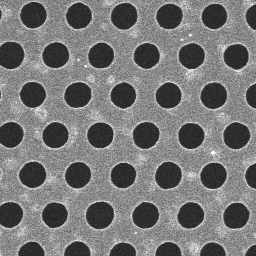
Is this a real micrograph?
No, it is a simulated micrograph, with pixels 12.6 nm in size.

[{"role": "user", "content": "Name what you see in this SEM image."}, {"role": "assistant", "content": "a regular array of holes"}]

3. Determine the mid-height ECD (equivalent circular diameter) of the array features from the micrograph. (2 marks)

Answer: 0.332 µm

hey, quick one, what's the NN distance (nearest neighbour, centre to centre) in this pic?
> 570 nm